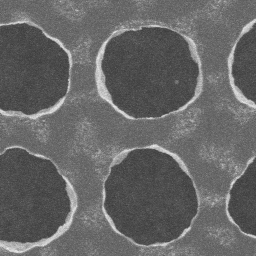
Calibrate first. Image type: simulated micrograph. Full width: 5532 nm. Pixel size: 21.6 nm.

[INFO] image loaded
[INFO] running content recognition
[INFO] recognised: holes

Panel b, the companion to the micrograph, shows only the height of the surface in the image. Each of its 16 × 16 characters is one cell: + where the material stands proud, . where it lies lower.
++++++++++++++++
+.++++++++++++++
...++++.....+++.
....++......+++.
....++......+++.
....+++.....+++.
....+++.....++++
++++++++++++++++
++++++++++++++++
..++++++..++++++
....+++....++++.
....+++.....+++.
....+++.....++..
....+++.....++..
...+++++...++++.
++++++++++++++++